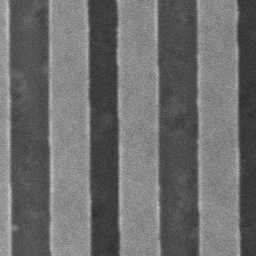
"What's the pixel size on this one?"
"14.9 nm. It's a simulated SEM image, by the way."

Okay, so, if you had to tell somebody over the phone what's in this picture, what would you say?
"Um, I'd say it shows lines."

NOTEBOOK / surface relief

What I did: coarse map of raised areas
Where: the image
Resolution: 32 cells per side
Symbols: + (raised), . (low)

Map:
+.....+++++....+++++.....+++++..
+.....+++++....+++++.....+++++..
+.....+++++....+++++.....+++++..
+.....+++++....+++++.....+++++..
+.....+++++....+++++.....+++++..
+.....+++++....+++++.....+++++..
+.....+++++....+++++.....+++++..
+.....+++++....+++++.....+++++..
+.....+++++....+++++.....+++++..
+.....+++++....+++++.....+++++..
+.....+++++....+++++.....+++++..
+.....+++++....+++++.....+++++..
+.....+++++....+++++.....+++++..
+.....+++++....+++++.....+++++..
+.....+++++....+++++.....+++++..
+.....+++++....+++++.....+++++..
+.....+++++....+++++.....+++++..
+.....+++++....+++++.....+++++..
+.....+++++....+++++.....+++++..
+.....+++++....+++++.....+++++..
+.....+++++....+++++.....+++++..
+.....+++++....+++++.....+++++..
+.....+++++....+++++.....+++++..
+.....+++++....+++++.....+++++..
+.....+++++....+++++.....+++++..
+.....+++++....+++++.....+++++..
+.....+++++....+++++.....+++++..
+.....+++++....+++++.....+++++..
+.....+++++....+++++.....+++++..
+.....+++++....+++++.....+++++..
+.....+++++....+++++.....+++++..
+.....+++++....+++++.....+++++..